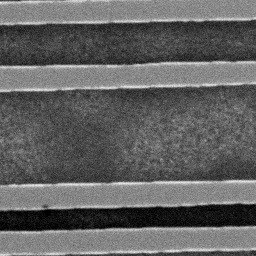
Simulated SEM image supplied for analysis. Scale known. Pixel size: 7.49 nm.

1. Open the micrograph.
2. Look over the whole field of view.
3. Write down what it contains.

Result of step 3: lines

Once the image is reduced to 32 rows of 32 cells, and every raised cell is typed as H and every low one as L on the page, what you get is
HHHHHHHHHHHHHHHHHHHHHHHHHHHHHHHH
HHHHHHHHHHHHHHHHHHHHHHHHHHHHHHHH
HHHHHHHHHHHHHHHHHHHHHHLLHLLLLLLL
LLLLLLLLLLLLLLLLLLLLLLLLLLLLLLLL
LLLLLLLLLLLLLLLLLLLLLLLLLLLLLLLL
LLLLLLLLLLLLLLLLLLLLLLLLLLLLLLLL
LLLLLLLLLLLLLLLLLLLLLLLLLLLLLLLL
LLLLLLLLLLLLLLLLLLLLLLLLLLLLLLLL
HHHHHHHHHHHHHHHHHHHHHHHHHHHHHHHH
HHHHHHHHHHHHHHHHHHHHHHHHHHHHHHHH
HHHHHHHHHHHHHHHHHHHHHHHHHHHHHHLL
LLLLLLLLLLLLLLLLLLLLLLLLLLLLLLLL
LLLLLLLLLLLLLLLLLLLLLLLLLLLLLLLL
LLLLLLLLLLLLLLLLLLLLLLLLLLLLLLLL
LLLLLLLLLLLLLLLLLLLLLLLLLLLLLLLL
LLLLLLLLLLLLLLLLLLLLLLLLLLLLLLLL
LLLLLLLLLLLLLLLLLLLLLLLLLLLLLLLL
LLLLLLLLLLLLLLLLLLLLLLLLLLLLLLLL
LLLLLLLLLLLLLLLLLLLLLLLLLLLLLLLL
LLLLLLLLLLLLLLLLLLLLLLLLLLLLLLLL
LLLLLLLLLLLLLLLLLLLLLLLLLLLLLLLL
LLLLLLLLLLLLLLLLLLLLLLLLLLLLLLLL
LLLLLLLLLLLLLLLLLLLLLLLLLLLLLLLL
HHHHHHHHHHHHHHHHHHHHHHHHHHHHHHHH
HHHHHHHHHHHHHHHHHHHHHHHHHHHHHHHH
HHHHHHHHHHHHHHHHHHHHHHHHHHLLLLLL
LLLLLLLLLLLLLLLLLLLLLLLLLLLLLLLL
LLLLLLLLLLLLLLLLLLLLLLLLLLLLLLLL
LLLLLLLLLLLLLLLLLLLLLLLLLLLLHHHH
HHHHHHHHHHHHHHHHHHHHHHHHHHHHHHHH
HHHHHHHHHHHHHHHHHHHHHHHHHHHHHHHH
HHHHHHHHHHHHHHHHHHHHLLLLLLLLLLLL